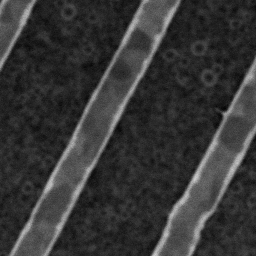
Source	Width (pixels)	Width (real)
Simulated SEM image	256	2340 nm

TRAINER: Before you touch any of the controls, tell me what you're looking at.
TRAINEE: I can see one or a few lines or trenches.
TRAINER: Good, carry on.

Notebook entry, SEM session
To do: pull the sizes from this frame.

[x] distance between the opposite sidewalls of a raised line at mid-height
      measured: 277 nanometers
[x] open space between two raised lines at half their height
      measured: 876 nm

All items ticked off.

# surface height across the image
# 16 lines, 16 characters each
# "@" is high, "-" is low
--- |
@@-------@@-----
@-------@@------
@-------@@------
-------@@-------
-------@@-------
------@@-------@
------@@-------@
-----@@-------@@
-----@@-------@@
----@@-------@@-
----@@-------@@-
---@@-------@@--
---@@------@@@--
--@@-------@@---
-@@@------@@----
-@@-------@@----